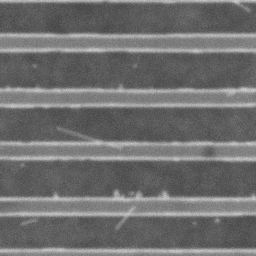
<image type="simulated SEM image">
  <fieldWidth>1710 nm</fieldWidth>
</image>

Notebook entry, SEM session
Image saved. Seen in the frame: lines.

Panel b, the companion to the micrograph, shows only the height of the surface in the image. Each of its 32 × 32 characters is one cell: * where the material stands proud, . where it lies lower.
................................
................................
................................
................................
********************************
********************************
................................
................................
................................
................................
................................
********************************
********************************
................................
................................
................................
................................
................................
********************************
********************************
................................
................................
................................
................................
................................
********************************
********************************
................................
................................
................................
................................
********************************